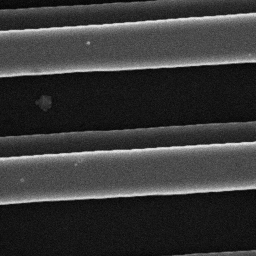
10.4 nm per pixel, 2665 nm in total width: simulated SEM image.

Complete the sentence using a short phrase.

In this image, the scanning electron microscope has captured lines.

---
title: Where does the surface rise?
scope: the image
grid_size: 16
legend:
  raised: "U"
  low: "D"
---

DDDUUUUUUUUUUUUU
UUUUUUUUUUUUUUUU
UUUUUUUUUUUUUUUU
UUUUUUUUUUUUUUUU
UUUUUDDDDDDDDDDD
DDDDDDDDDDDDDDDD
DDDDDDDDDDDDDDDD
DDDDDDDDDDDDDDDD
DUUUUUUUUUUUUUUU
UUUUUUUUUUUUUUUU
UUUUUUUUUUUUUUUU
UUUUUUUUUUUUUUUU
UUUUDDDDDDDDDDDD
DDDDDDDDDDDDDDDD
DDDDDDDDDDDDDDDD
DDDDDDDDDDDDDDDD